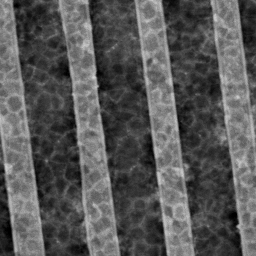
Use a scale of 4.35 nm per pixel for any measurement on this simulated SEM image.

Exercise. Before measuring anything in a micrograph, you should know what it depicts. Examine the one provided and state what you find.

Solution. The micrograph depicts one or a few lines or trenches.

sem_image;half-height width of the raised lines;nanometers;106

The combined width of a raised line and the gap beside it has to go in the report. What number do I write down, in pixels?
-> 74.7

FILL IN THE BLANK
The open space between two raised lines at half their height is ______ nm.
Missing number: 220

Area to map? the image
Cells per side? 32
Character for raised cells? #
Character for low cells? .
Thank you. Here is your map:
#.......###......###.......###..
##......###......###.......###..
##......###......###.......###..
##......###......####......###..
##......###.......###......###..
##......###.......###......###..
##.......###......###......###..
##.......###......###......###..
##.......###......###.......###.
###......###......###.......###.
###......###......###.......###.
###......###.......###......###.
###......###.......###......###.
###.......##.......###......###.
###.......##.......###......###.
###.......###......###......###.
###.......###......###.......###
####......###......###.......###
.###......###......###.......###
.###......###......###.......###
.###......###.......###......###
.###......###.......###......###
.###......###.......###......###
.###......####......###.......##
.###......####......###.......##
.####......###......###.......##
.####......###......####......##
..###......###.......###......##
..###......###.......###......##
..###......###.......###......##
..###......####......###......##
..###......####......###.......#